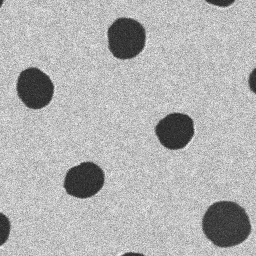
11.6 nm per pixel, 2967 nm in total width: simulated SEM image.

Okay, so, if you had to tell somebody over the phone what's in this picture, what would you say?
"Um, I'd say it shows holes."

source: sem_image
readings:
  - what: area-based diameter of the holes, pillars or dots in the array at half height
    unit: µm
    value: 0.451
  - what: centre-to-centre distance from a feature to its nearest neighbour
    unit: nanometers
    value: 1210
